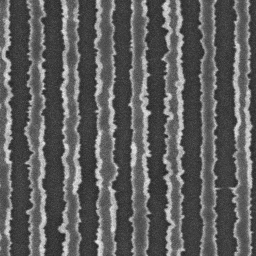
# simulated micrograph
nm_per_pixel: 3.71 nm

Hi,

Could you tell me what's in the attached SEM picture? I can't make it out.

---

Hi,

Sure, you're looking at parallel lines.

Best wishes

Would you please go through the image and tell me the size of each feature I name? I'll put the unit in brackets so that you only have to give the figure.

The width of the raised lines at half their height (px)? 15.3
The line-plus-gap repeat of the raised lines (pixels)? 34.3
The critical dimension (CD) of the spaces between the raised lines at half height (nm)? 71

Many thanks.